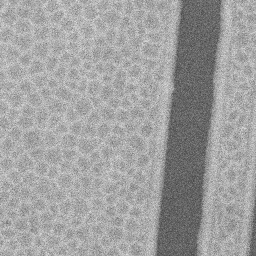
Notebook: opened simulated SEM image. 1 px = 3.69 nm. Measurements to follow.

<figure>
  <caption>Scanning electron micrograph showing one or a few lines or trenches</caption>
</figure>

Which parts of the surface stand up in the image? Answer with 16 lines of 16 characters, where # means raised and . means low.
###########...##
###########...##
###########...##
###########...##
##########....##
##########....##
##########....##
##########....##
##########....##
##########...###
##########...###
##########...###
##########...##.
##########...##.
#########....##.
#########....##.